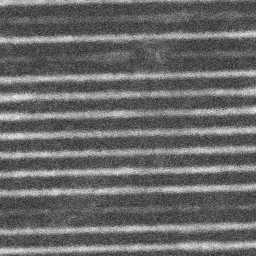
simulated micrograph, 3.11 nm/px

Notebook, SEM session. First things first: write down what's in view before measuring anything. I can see parallel lines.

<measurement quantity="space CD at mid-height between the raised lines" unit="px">14.7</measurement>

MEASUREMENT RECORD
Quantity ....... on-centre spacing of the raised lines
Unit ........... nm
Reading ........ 59.5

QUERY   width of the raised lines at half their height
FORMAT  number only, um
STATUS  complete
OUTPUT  0.0117